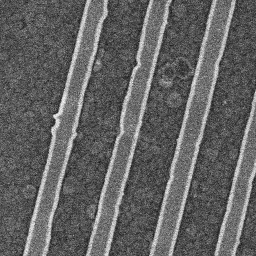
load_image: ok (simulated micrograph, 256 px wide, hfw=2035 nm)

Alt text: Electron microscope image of one or a few lines or trenches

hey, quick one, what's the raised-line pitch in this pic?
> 490 nm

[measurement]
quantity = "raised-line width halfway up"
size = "144 nm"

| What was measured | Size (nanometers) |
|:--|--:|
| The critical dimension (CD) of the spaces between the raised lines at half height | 348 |